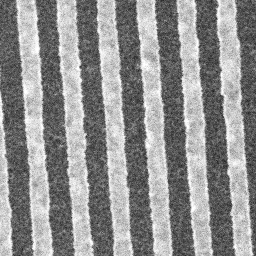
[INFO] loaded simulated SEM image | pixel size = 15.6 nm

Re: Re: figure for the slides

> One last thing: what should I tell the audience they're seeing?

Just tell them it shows parallel lines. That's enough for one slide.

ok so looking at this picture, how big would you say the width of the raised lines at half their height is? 0.261 microns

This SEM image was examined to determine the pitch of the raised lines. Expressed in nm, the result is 624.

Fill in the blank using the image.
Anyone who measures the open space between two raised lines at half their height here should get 0.357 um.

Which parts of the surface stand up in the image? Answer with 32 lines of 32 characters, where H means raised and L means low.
LLHHLLLHHLLLHHLLLHHLLLHHLLLHHLLL
LLHHLLLHHLLLHHLLLHHLLLHHLLLHHLLL
LLHHHLLHHLLLHHLLLHHLLLHHLLLHHLLL
LLHHHLLHHLLLHHLLLHHLLLHHLLLHHHLL
LLHHHLLHHHLLHHHLLHHHLLLHHLLHHHLL
LLLHLLLHHHLLHHHLLLHHLLLHHLLLHHLL
LLLHHLLLHHLLLHHLLLHHLLLHHLLLHHLL
LLLHHLLLHHLLLHHLLLHHLLLHHLLLHHLL
LLLHHLLLHHLLLHHLLLHHLLLHHLLLHHLL
LLLHHLLLHHLLLHHLLLHHLLLHHLLLHHLL
LLLHHLLLHHLLLHHLLLHHLLLHHLLLHHLL
LLLHHLLLHHLLLHHLLLHHLLLHHLLLHHLL
LLLHHLLLHHLLLHHLLLHHLLLHHLLLHHLL
LLLHHLLLHHLLLHHLLLHHLLLHHLLLHHLL
LLLHHLLLHHLLLHHLLLHHLLLHHLLLHHLL
LLLHHLLLHHLLLHHLLLHHLLLHHHLLHHLL
LLLHHLLLHHLLLHHLLLHHLLLHHLLLHHLL
LLLHHLLLHHHLLHHHLLHHLLLHHHLLHHLL
HLLLHLLLLHHLLHHLLLHHLLLHHHLLLHLL
HLLLHHLLLHHLLLHHLLHHHLLHHHLLLHHL
HLLLHHLLLHHLLLHHLLLHHLLHHHLLLHHL
HLLLHHLLLHHLLLHHLLLHHLLLHHLLLHHL
HLLLHHLLLHHLLLHHLLLHHLLLHHLLLHHL
HLLLHHLLLHHLLLHHLLLHHLLLHHLLLHHL
HLLLHHLLLHHLLLHHLLLHHLLLHHLLLHHL
HLLLHHLLLHHLLLHHLLLHHLLLHHLLLHHL
HLLLHHLLLHHLLLHHLLLHHLLLHHLLLHHL
HLLLHHLLLHHLLLHHLLLHHLLLHHLLLHHL
HLLLHHLLLHHLLLHHLLLHHLLLHHLLLHHL
HLLLHHLLLHHLLLHHLLLHHLLLHHLLLHHL
HLLLHHLLLHHLLLHHLLLHHLLLHHLLLHHL
HLLLHHLLLHHHLLHHLLLHHLLLHHLLLLHL